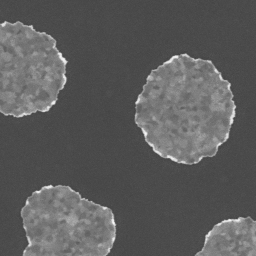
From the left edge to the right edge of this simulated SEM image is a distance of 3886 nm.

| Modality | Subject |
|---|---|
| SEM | raised bodies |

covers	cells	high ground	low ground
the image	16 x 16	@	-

----------------
@---------------
@@@-------------
@@@@-------@----
@@@@------@@@@--
@@@@-----@@@@@--
@@@------@@@@@@-
---------@@@@@@-
---------@@@@@--
----------@@@---
----------------
----------------
--@@@-----------
-@@@@@@---------
--@@@@@------@@@
--@@@@@------@@@